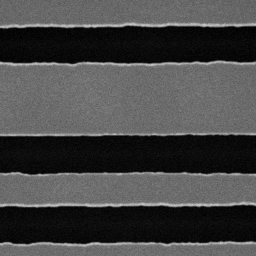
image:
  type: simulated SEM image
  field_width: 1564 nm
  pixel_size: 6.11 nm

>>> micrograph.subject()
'lines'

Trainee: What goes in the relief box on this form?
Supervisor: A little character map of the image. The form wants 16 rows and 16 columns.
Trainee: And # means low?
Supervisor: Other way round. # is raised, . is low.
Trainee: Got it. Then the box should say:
################
################
................
................
################
################
################
################
................
................
................
################
################
................
................
################